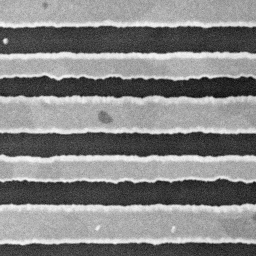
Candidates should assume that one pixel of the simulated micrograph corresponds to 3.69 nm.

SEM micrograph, lines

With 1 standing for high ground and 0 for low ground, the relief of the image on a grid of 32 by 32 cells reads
11111111111111111111111111111111
11111111111111111111111111111111
11111111111111111111111111111111
00000000000000000000000000000000
00000000000000000000000000000000
00000000000000000000000000000000
00000000000000000000000000000000
11111111111111111111111111111111
11111111111111111111111111111111
11111011111111111111111111111111
00000000000000000000000000000000
00000000000000000000000000000000
11111111111111111111111111111111
11111111111111111111111111111111
11111111111111111111111111111111
11111111111111111111111111111111
01001001110000100011110100011111
00000000000000000000000000000000
00000000000000000000000000000000
00000000000000000000000000000000
11111111111111111111111111111111
11111111111111111111111111111111
11111111111111111111111001100111
00000000000000000000000000000000
00000000000000000000000000000000
00000000000000000000000000000000
11111111111111111111111111111111
11111111111111111111111111111111
11111111111111111111111111111111
11111111111111111111111111111111
00000000000000000000000000000000
00000000000000000000000000000000